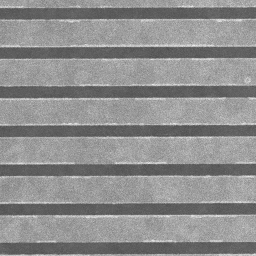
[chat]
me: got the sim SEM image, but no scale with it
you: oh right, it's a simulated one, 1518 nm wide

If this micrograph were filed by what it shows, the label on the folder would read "parallel lines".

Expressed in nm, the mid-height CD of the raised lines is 160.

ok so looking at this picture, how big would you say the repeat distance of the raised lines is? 232 nanometres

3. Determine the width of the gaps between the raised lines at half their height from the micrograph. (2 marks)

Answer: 0.0741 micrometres